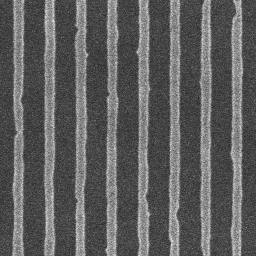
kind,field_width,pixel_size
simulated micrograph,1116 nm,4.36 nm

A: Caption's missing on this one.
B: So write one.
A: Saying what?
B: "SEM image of parallel lines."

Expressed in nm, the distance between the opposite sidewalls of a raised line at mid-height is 37.6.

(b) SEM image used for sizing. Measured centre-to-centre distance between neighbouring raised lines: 136 nm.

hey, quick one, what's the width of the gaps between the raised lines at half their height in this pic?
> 95.4 nm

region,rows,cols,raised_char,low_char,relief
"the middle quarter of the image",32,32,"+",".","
...++......++......++......++...
...++......++......++......++...
...++......++......++......++...
...++......++......++......++...
...++......++......++......++...
...++......++......++......++...
...++......++......++......++...
...++......++......++......++...
...++......++......++......++...
...++......++......++......++...
...++......++......++......++...
...++......++......++......++...
...++......++......++......++...
...+++.....++......++......++...
...++......++......++......++...
...++......++......++......++...
...++......++......++......++...
...++......++......++......++...
...++......++......++......++...
...++......++......++......++...
...++......++......++......++...
...++......++......++......++...
...++......++......++......++...
...++......++......++......++...
...++......++......++......++...
...++......++......++......++...
...++......++......++......++...
...++......++......++......++...
...++......++......++......++...
...++......++......++......++...
...++......++......++......++...
...++......++......++......++...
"